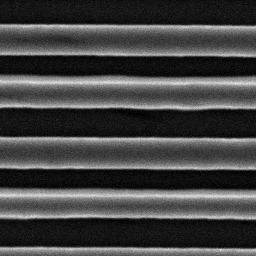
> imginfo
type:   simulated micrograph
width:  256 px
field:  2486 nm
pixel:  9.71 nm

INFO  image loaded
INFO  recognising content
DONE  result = lines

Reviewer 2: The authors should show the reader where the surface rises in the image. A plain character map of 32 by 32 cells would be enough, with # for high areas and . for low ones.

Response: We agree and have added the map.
................................
................................
................................
################################
################################
################################
################################
................................
................................
................................
################################
################################
################################
................................
................................
................................
................................
################################
################################
################################
################################
................................
................................
................................
################################
################################
################################
................................
................................
................................
................................
################################